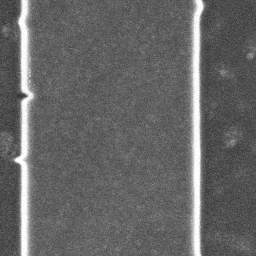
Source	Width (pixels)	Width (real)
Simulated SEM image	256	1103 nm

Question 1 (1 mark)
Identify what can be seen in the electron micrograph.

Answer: one or a few lines or trenches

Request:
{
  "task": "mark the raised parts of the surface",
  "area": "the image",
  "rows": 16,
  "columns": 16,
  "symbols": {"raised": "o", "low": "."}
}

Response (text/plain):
..oooooooooo....
.ooooooooooo....
..oooooooooo....
..oooooooooo....
..oooooooooo....
..oooooooooo....
..oooooooooo....
..oooooooooo....
..oooooooooo....
.ooooooooooo....
.ooooooooooo....
..oooooooooo....
..oooooooooo....
..oooooooooo....
..oooooooooo....
..oooooooooo....